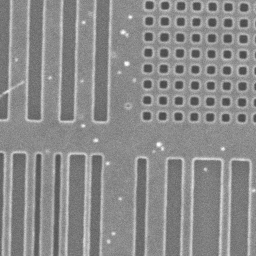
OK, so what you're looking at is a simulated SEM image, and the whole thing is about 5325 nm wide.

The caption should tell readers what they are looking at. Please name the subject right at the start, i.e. groups of lines, slits or small figures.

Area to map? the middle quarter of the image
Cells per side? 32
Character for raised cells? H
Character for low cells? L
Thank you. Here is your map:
LLLHHHHHLLLHHHHHHHHHLLHHLLHHLLHH
LLLHHHHLLLLHHHHHHHHHLLHHLLHHLLHH
LLLHHHHLLLLHHHHHHHHHHHHHHHHHHHHH
LLLHHHHLLLLHHHHHHHHHHHHHHHHHHHHH
LLLHHHHLLLLHHHHHHHHHLLHHLLHHLLHH
LLLHHHHLLLLHHHHHHHHHLLHHLLHHLLHH
LLLHHHHLLLLHHHHHHHHHHHHHHHHHHHHH
LLLHHHHLLLLHHHHHHHHHHHHHHHHHHHHH
LLLHHHHLLLLHHHHHHHHHLLHHLLHHLLHH
LLLHHHHLLLLHHHHHHHHHLLHHLLHHLLHL
LLLHHHHLLLLHHHHHHHHHHHHHHHHHHHHH
LLLHHHHLLLLHHHHHHHHHHHHHHHHHHHHH
LLLHHHHLLLLHHHHHHHHHLLHHLLHHLLHH
LLLHHHHLLLLHHHHHHHHHLLHHLLHHLLHL
HHHHHHHHHLHHHHHHHHHHHHHHHHHHHHHH
HHHHHHHHHHHHHHHHHHHHHHHHHHHHHHHH
HHHHHHHHHHHHHHHHHHHHHHHHHHHHHHHH
HHHHHHHHHHHHHHHHHHHHHHHHHHHHHHHH
HHHHHHHHHHHHHHHHHHHHHHHHHHHHHHHH
HHHHHHHHHHHHHHHHHHHHHHHHHHHHHHHH
HHHHHHHHHHHHHHHHHHHHHHHHHHHHHHHH
HHHHHHHHHHHHHHHHHHHHHHHHHHHHHHHH
HHLLLHHHHHHHHHHHHHHHHHHHHHHHHHHH
HLLLLLHLLLHHHHHHHHHLHHHHHHHHHHHH
HLLLLLHLLLHHHHHHHHLLLHHHHHLLLLHH
HLLLLLHLLLHHHHHHHHLLLHHHHHLLLLHH
HLLLLLHLLLHHHHHHHHLLLHHHHHLLLLHH
HLLLLLHLLLHHHHHHHHLLLHHHHHLLLLHH
HLLLLLHLLLHHHHHHHHLLLHHHHHLLLLHH
HLLLLHHLLLHHHHHHHHLLLHHHHLLLLLHH
HLLLLHLLLLHHHHHHHHLLLHHHHLLLLLHH
HLLLLLLLLLHHHHHHHHLLLHHHHLLLLLHH